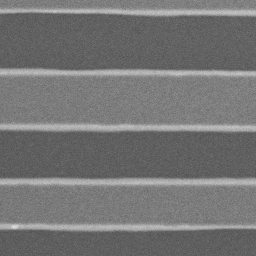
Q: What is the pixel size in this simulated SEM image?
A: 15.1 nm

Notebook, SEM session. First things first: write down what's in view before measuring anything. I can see lines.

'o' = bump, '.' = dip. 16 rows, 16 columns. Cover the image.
oooooooooooooooo
................
................
................
................
oooooooooooooooo
oooooooooooooooo
oooooooooooooooo
................
................
................
oooooooooooooooo
oooooooooooooooo
oooooooooooooooo
................
................